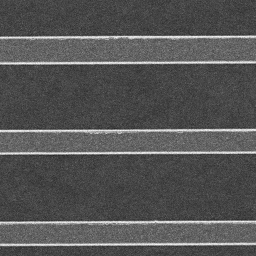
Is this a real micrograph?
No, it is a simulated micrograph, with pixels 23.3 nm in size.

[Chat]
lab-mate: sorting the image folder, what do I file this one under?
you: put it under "one or a few lines or trenches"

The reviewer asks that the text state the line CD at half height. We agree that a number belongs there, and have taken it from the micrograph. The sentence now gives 518 nm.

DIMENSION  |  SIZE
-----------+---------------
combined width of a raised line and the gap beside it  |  2.13 microns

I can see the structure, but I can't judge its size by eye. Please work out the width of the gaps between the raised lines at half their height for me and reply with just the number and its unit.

1590 nm